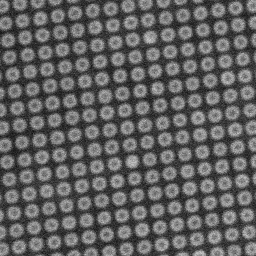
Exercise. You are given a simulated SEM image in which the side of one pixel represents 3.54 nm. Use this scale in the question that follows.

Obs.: a regular array of raised bodies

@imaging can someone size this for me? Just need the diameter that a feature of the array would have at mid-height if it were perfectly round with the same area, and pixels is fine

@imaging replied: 12.2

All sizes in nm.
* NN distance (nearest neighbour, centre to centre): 60.1